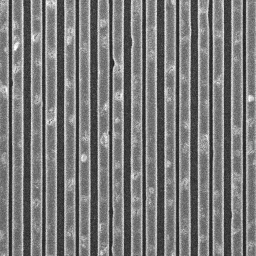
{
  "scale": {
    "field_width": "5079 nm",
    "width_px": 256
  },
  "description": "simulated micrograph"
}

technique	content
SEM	parallel lines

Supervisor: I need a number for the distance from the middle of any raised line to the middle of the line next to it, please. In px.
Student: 16.9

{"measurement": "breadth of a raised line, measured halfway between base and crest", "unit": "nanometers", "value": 226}